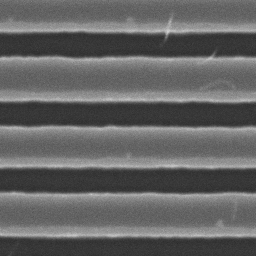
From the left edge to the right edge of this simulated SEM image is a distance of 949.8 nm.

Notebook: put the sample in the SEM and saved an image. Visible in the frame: lines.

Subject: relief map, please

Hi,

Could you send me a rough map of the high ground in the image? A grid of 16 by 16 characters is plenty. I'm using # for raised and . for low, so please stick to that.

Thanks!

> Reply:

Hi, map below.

################
################
................
................
################
################
................
................
################
################
................
................
################
################
################
................